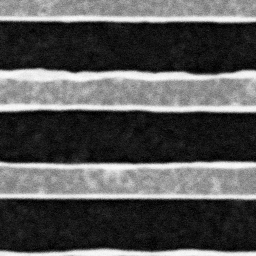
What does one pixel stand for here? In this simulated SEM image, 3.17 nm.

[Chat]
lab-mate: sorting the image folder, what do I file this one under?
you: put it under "one or a few lines or trenches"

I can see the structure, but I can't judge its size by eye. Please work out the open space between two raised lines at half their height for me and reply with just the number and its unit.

0.181 microns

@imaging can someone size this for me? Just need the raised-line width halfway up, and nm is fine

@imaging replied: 101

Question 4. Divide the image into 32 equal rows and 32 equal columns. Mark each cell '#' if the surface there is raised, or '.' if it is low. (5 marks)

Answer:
################################
################################
................................
................................
................................
................................
................................
................................
................................
######......####..............##
################################
################################
################################
#..................######..#####
................................
................................
................................
................................
................................
................................
................................
################################
################################
################################
##..############.......#########
................................
................................
................................
................................
................................
................................
................................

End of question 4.